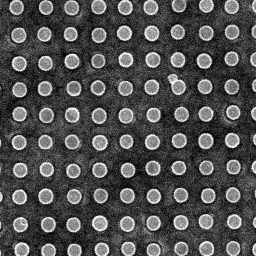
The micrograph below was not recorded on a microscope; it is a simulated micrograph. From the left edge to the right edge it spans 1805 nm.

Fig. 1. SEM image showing a regular array of raised bodies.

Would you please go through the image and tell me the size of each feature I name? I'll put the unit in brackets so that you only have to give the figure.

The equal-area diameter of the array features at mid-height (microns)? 0.0988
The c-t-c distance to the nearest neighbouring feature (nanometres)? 182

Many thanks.